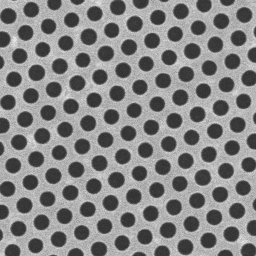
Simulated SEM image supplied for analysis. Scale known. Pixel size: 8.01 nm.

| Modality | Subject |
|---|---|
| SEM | a regular array of holes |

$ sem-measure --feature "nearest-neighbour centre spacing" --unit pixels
23.7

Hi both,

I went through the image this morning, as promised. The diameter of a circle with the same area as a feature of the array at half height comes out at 0.119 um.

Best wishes